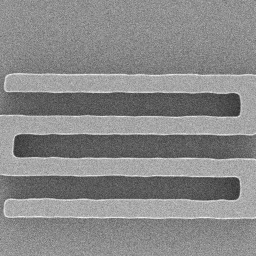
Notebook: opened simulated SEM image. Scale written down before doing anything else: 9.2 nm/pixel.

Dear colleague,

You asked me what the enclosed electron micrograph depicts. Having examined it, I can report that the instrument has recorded groups of lines, slits or small figures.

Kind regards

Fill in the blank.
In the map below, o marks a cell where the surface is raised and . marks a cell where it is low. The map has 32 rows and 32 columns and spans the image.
................................
................................
................................
................................
................................
................................
................................
................................
................................
.ooooooooooooooooooooooooooooooo
.ooooooooooooooooooooooooooooooo
......oooooooooooooooooooooooooo
..............................oo
..............................oo
oooo......oo..................oo
oooooooooooooooooooooooooooooooo
oooooooooooooooooooooooooooooooo
oo..............................
oo..............................
oo..............................
oooooooooooooooooooooooooooooooo
oooooooooooooooooooooooooooooooo
..............................oo
..............................oo
..............................oo
.ooooooooooooooooooooooooooooooo
.ooooooooooooooooooooooooooooooo
................................
................................
................................
................................
................................